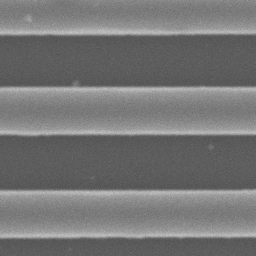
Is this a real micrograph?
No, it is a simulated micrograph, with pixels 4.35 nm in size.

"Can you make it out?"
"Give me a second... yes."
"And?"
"lines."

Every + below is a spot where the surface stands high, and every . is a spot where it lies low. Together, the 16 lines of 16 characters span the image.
++++++++++++++++
++++++++++++++++
................
................
................
++++++++++++++++
++++++++++++++++
++++++++++++++++
................
................
................
................
++++++++++++++++
++++++++++++++++
++++++++++++++++
................